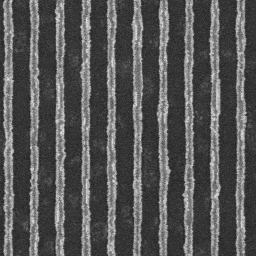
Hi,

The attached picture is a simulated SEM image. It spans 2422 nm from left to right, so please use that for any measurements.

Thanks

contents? parallel lines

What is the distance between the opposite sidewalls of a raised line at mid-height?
0.0697 microns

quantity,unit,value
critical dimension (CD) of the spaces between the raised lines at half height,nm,174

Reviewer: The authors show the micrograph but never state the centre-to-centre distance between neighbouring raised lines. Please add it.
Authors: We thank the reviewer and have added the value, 244 nanometers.